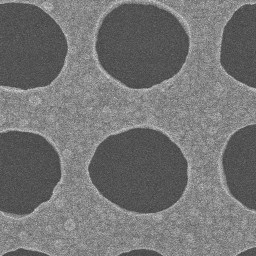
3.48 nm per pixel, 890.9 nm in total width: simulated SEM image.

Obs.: holes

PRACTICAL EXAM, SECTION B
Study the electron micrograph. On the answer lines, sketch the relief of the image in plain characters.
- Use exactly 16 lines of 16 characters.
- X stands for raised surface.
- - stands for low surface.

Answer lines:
--XXXXX---XXXXX-
----XX-----XXX--
----XX------XX--
----XX------XX--
----XXX----XXX--
X-XXXXXX-XXXXXXX
XXXXXXXXXXXXXXXX
XXXXXXXXXXXXXXXX
---XXXX---XXXX--
----XX-----XXX--
----XX------XX--
----XX------XX--
---XXXX----XXXX-
X-XXXXXXXXXXXXXX
XXXXXXXXXXXXXXXX
XXXXXXXXXXXXXXXX